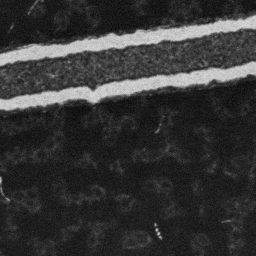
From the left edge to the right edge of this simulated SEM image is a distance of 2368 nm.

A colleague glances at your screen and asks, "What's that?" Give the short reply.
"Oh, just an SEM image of one or a few lines or trenches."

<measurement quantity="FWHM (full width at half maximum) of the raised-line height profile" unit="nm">444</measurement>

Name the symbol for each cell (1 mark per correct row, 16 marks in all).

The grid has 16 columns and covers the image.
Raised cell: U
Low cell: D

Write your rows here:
DDDDDDDDDDDDDDDD
DDDDDDDDDDDDDDDU
DDDDDDDDUUUUUUUU
DUUUUUUUUUUUUUUU
UUUUUUUUUUUUUUUD
UUUUUUUUDDDDDDDD
UDDDDDDDDDDDDDDD
DDDDDDDDDDDDDDDD
DDDDDDDDDDDDDDDD
DDDDDDDDDDDDDDDD
DDDDDDDDDDDDDDDD
DDDDDDDDDDDDDDDD
DDDDDDDDDDDDDDDD
DDDDDDDDDDDDDDDD
DDDDDDDDDDDDDDDD
DDDDDDDDDDDDDDDD